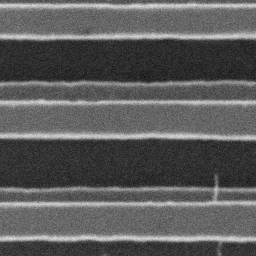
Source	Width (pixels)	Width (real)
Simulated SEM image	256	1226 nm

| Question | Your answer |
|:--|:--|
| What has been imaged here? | lines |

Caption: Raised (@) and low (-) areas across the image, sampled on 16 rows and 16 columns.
@@@@@@@@@@@@@@@@
@@@@@@@@@@@@@@@@
----------------
----------------
----------------
@@@@@@@@@@@@@@@@
@@@@@@@@@@@@@@@@
@@@@@@@@@@@@@@@@
@@@@@@@@@@@@@@@@
----------------
----------------
----------------
@@@@@@@@@@@@@@@@
@@@@@@@@@@@@@@@@
@@@@@@@@@@@@@@@@
----------------